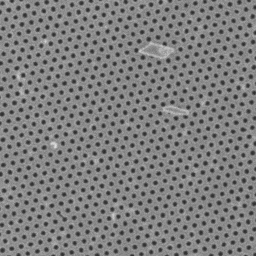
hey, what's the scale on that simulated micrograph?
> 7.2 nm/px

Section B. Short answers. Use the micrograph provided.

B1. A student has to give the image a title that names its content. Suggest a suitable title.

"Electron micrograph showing a regular array of holes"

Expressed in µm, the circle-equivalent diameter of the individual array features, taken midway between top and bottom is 0.0363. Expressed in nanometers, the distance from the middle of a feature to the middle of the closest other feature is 67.